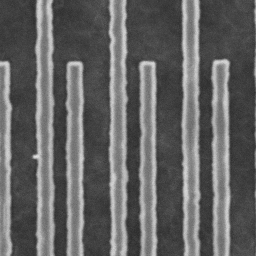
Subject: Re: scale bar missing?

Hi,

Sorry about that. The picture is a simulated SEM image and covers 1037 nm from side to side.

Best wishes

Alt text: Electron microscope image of parallel lines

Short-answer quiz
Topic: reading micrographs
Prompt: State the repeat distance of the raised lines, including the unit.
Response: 35.1 px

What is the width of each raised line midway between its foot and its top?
54.1 nm